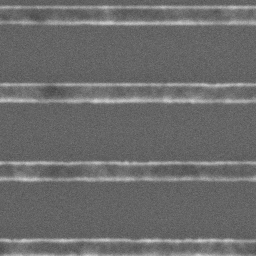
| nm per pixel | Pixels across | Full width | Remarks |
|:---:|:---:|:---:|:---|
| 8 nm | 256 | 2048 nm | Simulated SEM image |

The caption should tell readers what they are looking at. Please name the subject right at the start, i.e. lines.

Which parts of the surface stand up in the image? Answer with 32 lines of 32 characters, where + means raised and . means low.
................................
++++++++++++++++++++++++++++++++
++++++++++++++++++++++++++++++++
................................
................................
................................
................................
................................
................................
................................
................................
++++++++++++++++++++++++++++++++
++++++++++++++++++++++++++++++++
................................
................................
................................
................................
................................
................................
................................
++++++++++++++++++++++++++++++++
++++++++++++++++++++++++++++++++
................................
................................
................................
................................
................................
................................
................................
................................
++++++++++++++++++++++++++++++++
++++++++++++++++++++++++++++++++